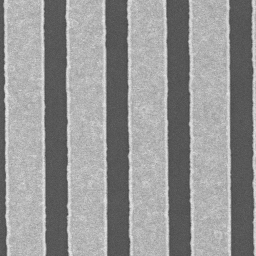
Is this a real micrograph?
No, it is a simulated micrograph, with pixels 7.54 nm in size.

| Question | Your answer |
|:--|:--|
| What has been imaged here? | lines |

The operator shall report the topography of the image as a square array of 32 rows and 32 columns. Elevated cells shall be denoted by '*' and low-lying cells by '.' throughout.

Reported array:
.****...*****...*****...*****...
.****...*****...*****...*****...
.****...*****...*****...*****...
.****...*****...*****...*****...
.****...*****...*****...*****...
.****...*****...*****...*****...
.****...*****...*****...*****...
.****...*****...*****...*****...
.****...*****...*****...*****...
.****...*****...*****...*****...
.****...*****...*****...*****...
.****...*****...*****...*****...
.****...*****...*****...*****...
.****...*****...*****...*****...
.****...*****...*****...*****...
.****...*****...*****...*****...
.*****..*****...*****...*****...
.****...*****...*****...*****...
.*****..*****...*****...*****...
.*****...****...*****...*****...
.*****..*****...*****...*****...
.*****..*****...*****...*****...
.*****..*****...*****...*****...
.*****...****...*****...*****...
.*****...****...*****...*****...
.*****..*****...*****...*****...
.*****...****...*****...*****...
.*****..*****...*****...*****...
.*****..*****...*****...*****...
.*****...****...*****...*****...
.*****...****...*****...*****...
.*****...****...*****...*****...